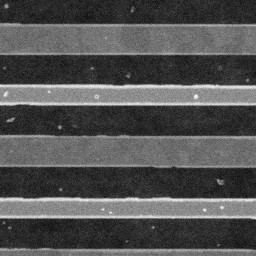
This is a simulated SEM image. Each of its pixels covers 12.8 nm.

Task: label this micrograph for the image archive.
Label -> lines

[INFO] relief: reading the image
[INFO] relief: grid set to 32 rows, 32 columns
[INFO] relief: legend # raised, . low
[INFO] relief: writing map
................................
................................
................................
################################
################################
################################
################################
................................
................................
................................
................................
################################
################################
................................
................................
................................
................................
################################
################################
################################
################################
................................
................................
................................
................................
################################
################################
................................
................................
................................
................................
################################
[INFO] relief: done